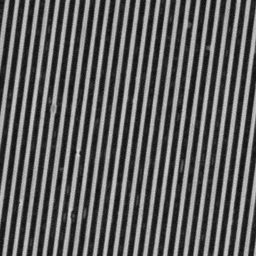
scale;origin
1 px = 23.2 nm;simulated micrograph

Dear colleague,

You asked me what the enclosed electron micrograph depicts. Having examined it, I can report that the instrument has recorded parallel lines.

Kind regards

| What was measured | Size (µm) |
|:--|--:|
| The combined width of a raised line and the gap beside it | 0.231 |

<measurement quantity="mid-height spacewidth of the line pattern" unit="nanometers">158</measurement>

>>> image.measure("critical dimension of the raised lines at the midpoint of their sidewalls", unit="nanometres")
89.1